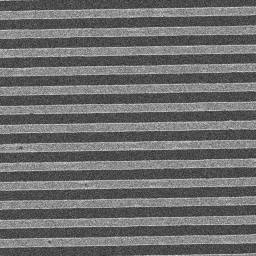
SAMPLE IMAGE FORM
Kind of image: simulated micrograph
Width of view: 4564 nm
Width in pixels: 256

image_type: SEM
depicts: parallel lines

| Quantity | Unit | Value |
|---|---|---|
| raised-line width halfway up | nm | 147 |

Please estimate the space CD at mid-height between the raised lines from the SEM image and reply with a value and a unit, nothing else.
0.196 microns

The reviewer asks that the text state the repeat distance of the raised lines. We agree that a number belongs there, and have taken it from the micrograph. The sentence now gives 339 nm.